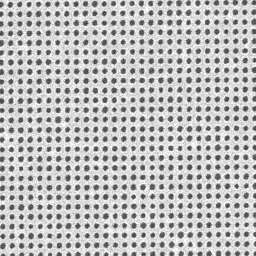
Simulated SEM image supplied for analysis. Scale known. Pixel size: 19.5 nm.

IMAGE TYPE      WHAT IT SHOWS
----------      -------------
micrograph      a regular array of holes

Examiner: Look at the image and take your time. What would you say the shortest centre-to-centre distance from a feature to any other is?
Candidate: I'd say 180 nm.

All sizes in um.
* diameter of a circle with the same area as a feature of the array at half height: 0.117